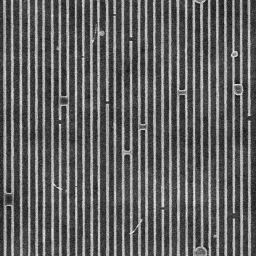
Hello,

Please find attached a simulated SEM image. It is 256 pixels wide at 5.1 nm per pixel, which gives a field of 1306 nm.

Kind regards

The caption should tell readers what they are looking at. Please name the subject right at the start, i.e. parallel lines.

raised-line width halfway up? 10.2 nm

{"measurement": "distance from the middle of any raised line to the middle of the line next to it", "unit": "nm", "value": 40.2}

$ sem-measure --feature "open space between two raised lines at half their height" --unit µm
0.0312